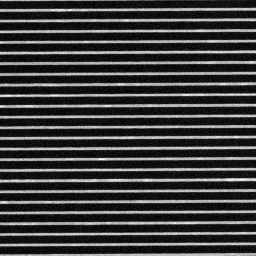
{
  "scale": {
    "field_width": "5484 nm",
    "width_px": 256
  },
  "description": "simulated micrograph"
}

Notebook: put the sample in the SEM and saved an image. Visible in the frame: parallel lines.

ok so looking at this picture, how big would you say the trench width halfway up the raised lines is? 182 nanometers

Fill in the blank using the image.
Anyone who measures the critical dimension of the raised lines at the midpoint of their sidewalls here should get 42.8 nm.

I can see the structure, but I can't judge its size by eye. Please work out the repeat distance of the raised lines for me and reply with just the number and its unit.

0.228 micrometres